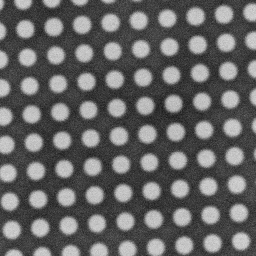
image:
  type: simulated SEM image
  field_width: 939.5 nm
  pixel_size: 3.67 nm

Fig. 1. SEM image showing an array of small figures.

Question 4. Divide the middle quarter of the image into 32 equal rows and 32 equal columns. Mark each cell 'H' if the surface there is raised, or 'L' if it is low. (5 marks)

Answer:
LLLLLLLLLLLLLLLLLLLLLLLLLLLLLLLL
LLLLLLLLLLLLLLLLLLLHHLLLLHHHLLLL
LLLLLHLLLLLHHHLLLLHHHHLLLHHHHLLL
LLLLHHHHLLLHHHHLLLHHHHLLLHHHHLLL
HLLLHHHHLLLHHHHLLLHHHHLLLLHHLLLL
HLLLHHHLLLLHHHLLLLLLLLLLLLLLLLLL
LLLLLLLLLLLLLLLLLLLLLLLLLLLLLLLL
LLLLLLLLLLLLLLLLLLLLLLLLLLLLLLLL
LLLLLLLLLLLLLLLLLLLLHLLLLLHHHLLL
LLLLLLHLLLLLHHHLLLHHHHLLLHHHHLLL
LLLLHHHHLLLHHHHLLLHHHHLLLHHHHLLL
HLLLHHHHLLLHHHHLLLLHHHLLLLHHHLLL
HLLLHHHHLLLLHHHLLLLLHLLLLLLLLLLL
HLLLLLHLLLLLLLLLLLLLLLLLLLLLLLLL
LLLLLLLLLLLLLLLLLLLLLLLLLLLLLLLL
LLLLLLLLLLLLLLLLLLLLHHLLLLHHHLLL
LLLLLLLLLLLLHHHLLLLHHHHLLLHHHHLL
HLLLLHHHLLLLHHHHLLLHHHHLLLHHHHLL
HHLLLHHHHLLLHHHHLLLHHHHLLLHHHHLL
HHLLLHHHHLLLHHHLLLLLHHLLLLLLLLLL
HLLLLLHHLLLLLLLLLLLLLLLLLLLLLLLL
LLLLLLLLLLLLLLLLLLLLLLLLLLLLLLLL
LLLLLLLLLLLLLLLLLLLLLLLLLLLHHHLL
LLLLLLLLLLLLLHHHLLLLHHHLLLHHHHHL
HLLLLLHHHLLLHHHHLLLHHHHLLLHHHHHL
HHLLLHHHHLLLHHHHLLLHHHHLLLLHHHLL
HHLLLHHHHLLLLHHHLLLLHHLLLLLLLLLL
HHLLLLHHLLLLLLLLLLLLLLLLLLLLLLLL
LLLLLLLLLLLLLLLLLLLLLLLLLLLLLLLL
LLLLLLLLLLLLLLLLLLLLLLLLLLLLHHLL
LLLLLLLLLLLLLLHHLLLLHHHHLLLHHHHL
HHLLLLHHHLLLLHHHHLLLHHHHLLLHHHHL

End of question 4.